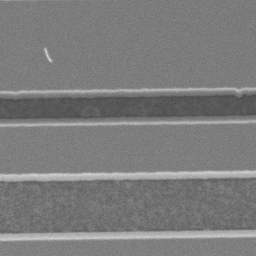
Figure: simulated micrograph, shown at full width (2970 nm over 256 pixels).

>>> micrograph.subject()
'one or a few lines or trenches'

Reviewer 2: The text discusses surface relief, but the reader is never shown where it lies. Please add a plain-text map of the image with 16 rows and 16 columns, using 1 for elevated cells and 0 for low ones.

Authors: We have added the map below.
1111111111111111
1111111111111111
1111111111111111
1111111111111111
1111111111111111
1111111111111111
0000000000000000
0000000000000011
1111111111111111
1111111111111111
1111111111111111
0000000000000000
0000000000000000
0000000000000000
0000000000000000
1111111111111111